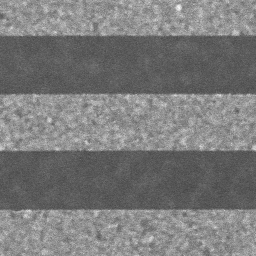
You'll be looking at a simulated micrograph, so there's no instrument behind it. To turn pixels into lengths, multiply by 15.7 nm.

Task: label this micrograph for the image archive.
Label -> one or a few lines or trenches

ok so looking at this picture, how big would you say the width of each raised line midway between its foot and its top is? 872 nm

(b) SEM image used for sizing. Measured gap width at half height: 933 nanometres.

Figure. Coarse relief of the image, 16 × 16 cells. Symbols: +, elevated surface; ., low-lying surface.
++++++++++++++++
++++++++++++++++
................
................
................
................
++++++++++++++++
++++++++++++++++
++++++++++++++++
................
................
................
................
++++++++++++++++
++++++++++++++++
++++++++++++++++